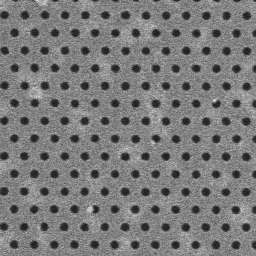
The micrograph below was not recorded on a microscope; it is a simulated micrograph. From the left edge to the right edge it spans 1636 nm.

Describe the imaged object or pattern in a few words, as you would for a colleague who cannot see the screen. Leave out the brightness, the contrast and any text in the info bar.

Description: a regular array of holes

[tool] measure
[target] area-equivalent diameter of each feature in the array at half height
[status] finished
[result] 54.4 nm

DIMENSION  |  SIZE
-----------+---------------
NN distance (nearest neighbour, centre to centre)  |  126 nm